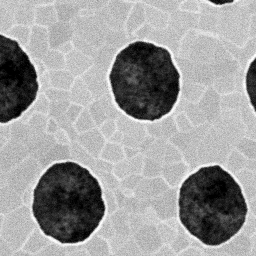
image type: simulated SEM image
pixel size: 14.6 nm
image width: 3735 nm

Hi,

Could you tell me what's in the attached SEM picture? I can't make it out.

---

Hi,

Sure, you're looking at holes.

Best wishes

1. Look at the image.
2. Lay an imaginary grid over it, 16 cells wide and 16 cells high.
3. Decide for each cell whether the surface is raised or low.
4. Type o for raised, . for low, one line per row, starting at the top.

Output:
oooooooooooooooo
oooooooooooooooo
.ooooooooooooooo
..ooooo....ooooo
..ooooo....oooo.
..ooooo....oooo.
..ooooo....ooooo
.oooooooo.oooooo
oooooooooooooooo
oooooooooooooooo
ooo..oooooooo.oo
oo....ooooo....o
oo.....oooo....o
oo.....oooo....o
ooo...oooooo...o
oooooooooooooooo